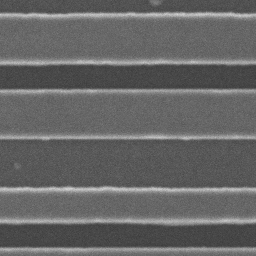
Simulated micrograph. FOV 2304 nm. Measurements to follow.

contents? lines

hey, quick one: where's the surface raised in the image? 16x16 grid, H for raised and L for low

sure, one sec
LLLLLLLLLLLLLLLL
HHHHHHHHHHHHHHHH
HHHHHHHHHHHHHHHH
HHHHHHHHHHHHHHHH
LLLLLLLLLLLLLLLL
LLLLLLLLLLLLLLLL
HHHHHHHHHHHHHHHH
HHHHHHHHHHHHHHHH
HHHHHHHHHHHHHHHH
LLLLLLLLLLLLLLLL
LLLLLLLLLLLLLLLL
LLLLLLLLLLLLLLLL
HHHHHHHHHHHHHHHH
HHHHHHHHHHHHHHHH
LLLLLLLLLLLLLLLL
LLLLLLLLLLLLLLLL